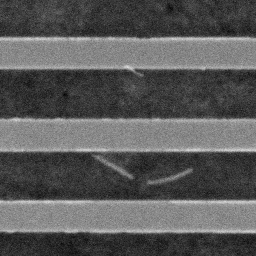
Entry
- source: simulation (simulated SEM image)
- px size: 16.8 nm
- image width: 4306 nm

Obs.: lines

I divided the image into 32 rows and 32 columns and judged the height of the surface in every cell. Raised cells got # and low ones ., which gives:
................................
................................
................................
................................
................................
################################
################################
################################
################################
................................
................................
................................
................................
................................
................................
################################
################################
################################
################################
................................
................................
................................
................................
................................
................................
################################
################################
################################
################################
................................
................................
................................